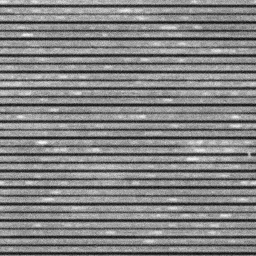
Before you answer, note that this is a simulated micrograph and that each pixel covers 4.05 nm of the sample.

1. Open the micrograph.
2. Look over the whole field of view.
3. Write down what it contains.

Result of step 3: parallel lines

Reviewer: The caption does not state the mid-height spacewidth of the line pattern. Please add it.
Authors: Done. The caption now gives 14.7 nanometres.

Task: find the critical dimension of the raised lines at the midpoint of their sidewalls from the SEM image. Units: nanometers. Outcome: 25.3